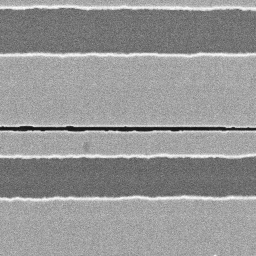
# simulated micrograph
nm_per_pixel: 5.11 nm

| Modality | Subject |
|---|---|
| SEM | lines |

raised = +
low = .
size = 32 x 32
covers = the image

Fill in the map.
++++++++++++++++++++++++++++++++
................................
................................
................................
................................
................................
................................
++++++++++++++++++++++++++++++++
++++++++++++++++++++++++++++++++
++++++++++++++++++++++++++++++++
++++++++++++++++++++++++++++++++
++++++++++++++++++++++++++++++++
++++++++++++++++++++++++++++++++
++++++++++++++++++++++++++++++++
++++++++++++++++++++++++++++++++
++++++++++++++++++++++++++++++++
+++++++++.++++++++++++++++++++++
++++++++++++++++++++++++++++++++
++++++++++++++++++++++++++++++++
++++++++++++++++++++...++++++++.
................................
................................
................................
................................
................................
++++++++++++++++++++++++++++++++
++++++++++++++++++++++++++++++++
++++++++++++++++++++++++++++++++
++++++++++++++++++++++++++++++++
++++++++++++++++++++++++++++++++
++++++++++++++++++++++++++++++++
++++++++++++++++++++++++++++++++